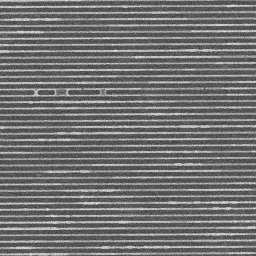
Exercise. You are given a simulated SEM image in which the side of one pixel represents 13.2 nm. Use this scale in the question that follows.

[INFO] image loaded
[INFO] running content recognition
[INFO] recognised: parallel lines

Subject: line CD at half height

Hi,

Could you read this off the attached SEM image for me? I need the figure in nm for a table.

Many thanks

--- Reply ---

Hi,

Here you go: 19.8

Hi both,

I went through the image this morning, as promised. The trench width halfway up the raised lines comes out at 66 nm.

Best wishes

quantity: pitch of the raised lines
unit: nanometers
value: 83.7